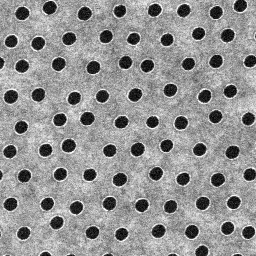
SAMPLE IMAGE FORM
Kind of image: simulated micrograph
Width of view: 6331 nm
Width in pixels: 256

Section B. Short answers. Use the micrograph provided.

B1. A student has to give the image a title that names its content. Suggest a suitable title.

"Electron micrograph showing a regular array of holes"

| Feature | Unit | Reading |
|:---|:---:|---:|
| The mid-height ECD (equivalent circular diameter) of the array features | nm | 353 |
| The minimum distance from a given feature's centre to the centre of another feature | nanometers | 676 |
